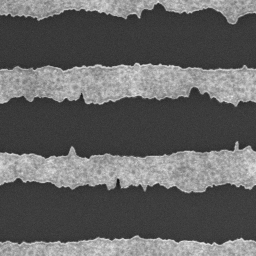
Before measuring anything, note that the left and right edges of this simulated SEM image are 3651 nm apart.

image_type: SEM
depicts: one or a few lines or trenches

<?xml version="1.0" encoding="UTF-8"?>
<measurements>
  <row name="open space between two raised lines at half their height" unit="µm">0.79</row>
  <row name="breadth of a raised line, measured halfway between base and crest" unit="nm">431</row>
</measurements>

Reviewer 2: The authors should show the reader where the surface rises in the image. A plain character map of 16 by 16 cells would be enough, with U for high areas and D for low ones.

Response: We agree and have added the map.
UUUUUUUUUDUUUUUU
DDDDDDDDDDDDDDDD
DDDDDDDDDDDDDDDD
DDDDDDDDDDDDDDDD
UUUUUUUUUUUUUUUU
UUUUUUUUUUUUUUUU
DDDDDDDDDDDDDDDD
DDDDDDDDDDDDDDDD
DDDDDDDDDDDDDDDD
DDDDDDDDDDDDDUUU
UUUUUUUUUUUUUUUU
DDDUUUUUUUUUUUUU
DDDDDDDDDDDDDDDD
DDDDDDDDDDDDDDDD
DDDDDDDDDDDDDDDD
UUUUUUUUUUUUUUUU